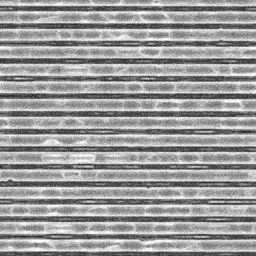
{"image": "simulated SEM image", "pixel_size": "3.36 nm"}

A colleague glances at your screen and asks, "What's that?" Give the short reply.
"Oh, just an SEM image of parallel lines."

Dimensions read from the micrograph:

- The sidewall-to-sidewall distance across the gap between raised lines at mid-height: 21 nm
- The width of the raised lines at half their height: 0.0366 µm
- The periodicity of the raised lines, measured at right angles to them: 59 nanometers